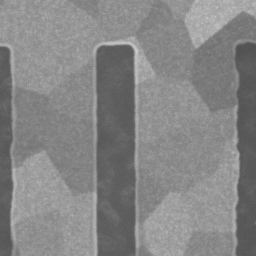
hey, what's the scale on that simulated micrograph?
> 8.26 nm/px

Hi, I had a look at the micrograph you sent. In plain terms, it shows one or a few lines or trenches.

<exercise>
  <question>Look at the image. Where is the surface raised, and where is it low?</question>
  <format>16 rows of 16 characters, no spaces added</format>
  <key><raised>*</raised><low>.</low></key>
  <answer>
****************
****************
****************
.*****..*******.
.*****..*******.
.*****...******.
.*****...******.
.*****...******.
.*****...******.
.*****...******.
.*****...******.
.*****...******.
.*****...******.
.*****...******.
.*****...******.
.*****...******.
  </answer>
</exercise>